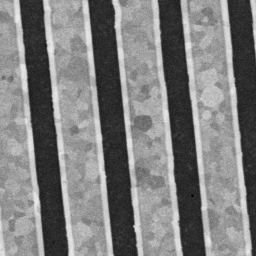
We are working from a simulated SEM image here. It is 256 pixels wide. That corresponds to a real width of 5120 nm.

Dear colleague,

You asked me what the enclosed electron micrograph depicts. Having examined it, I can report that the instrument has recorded one or a few lines or trenches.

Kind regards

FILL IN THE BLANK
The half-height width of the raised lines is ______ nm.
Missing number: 789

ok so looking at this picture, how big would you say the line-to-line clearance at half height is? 0.597 um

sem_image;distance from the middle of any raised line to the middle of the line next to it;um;1.38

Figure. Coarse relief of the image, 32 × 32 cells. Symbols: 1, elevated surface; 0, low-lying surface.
11000011111000011110000111110000
11000011111000011110000111110000
11000011111000011110000111110000
11000011111000011111000111110000
11000011111000011111000111110000
11100011111000011111000011111000
11100011111000011111000011111000
11100011111000011111000011111000
11100001111000011111000011111000
11100001111100011111000011111000
11100001111100011111000011111000
11100001111100001111000011111000
11100001111100001111100011111000
11100001111100001111100011111000
11100001111100001111100011111000
11110001111100001111100001111000
11110001111100001111100001111100
11110000111100001111100001111100
11110000111100001111100001111100
11110000111110001111100001111100
11110000111110001111100001111100
11110000111110000111100001111100
11110000111110000111100001111100
11110000111110000111110001111100
11110000111110000111110001111100
11111000111110000111110000111100
11111000111110000111110000111110
11111000011110000111110000111110
11111000011110000111110000111110
11111000011111000111110000111110
11111000011111000111110000111110
11111000011111000011110000111110